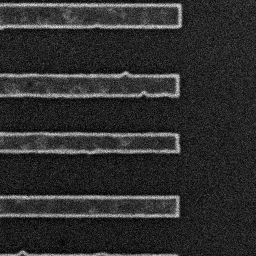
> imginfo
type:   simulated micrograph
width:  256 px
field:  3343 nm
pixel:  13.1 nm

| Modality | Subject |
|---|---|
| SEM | one or a few lines or trenches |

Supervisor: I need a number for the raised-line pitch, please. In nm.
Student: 830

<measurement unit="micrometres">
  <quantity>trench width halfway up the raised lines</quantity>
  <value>0.603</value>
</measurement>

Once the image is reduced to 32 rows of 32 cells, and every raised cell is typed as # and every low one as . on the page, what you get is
................................
######################..........
######################..........
................................
................................
................................
................................
................................
................................
...#.#.........##...............
######################..........
######################..........
................................
................................
................................
................................
................................
######################..........
######################..........
................................
................................
................................
................................
................................
................................
######################..........
######################..........
................................
................................
................................
................................
................................